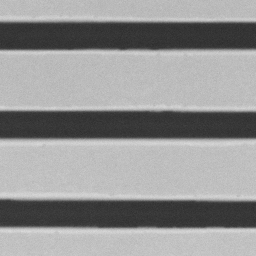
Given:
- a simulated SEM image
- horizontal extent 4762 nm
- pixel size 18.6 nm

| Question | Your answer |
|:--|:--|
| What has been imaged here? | lines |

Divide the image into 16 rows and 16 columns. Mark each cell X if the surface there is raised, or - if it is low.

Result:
XXXXXXXXXXXXXXXX
----------------
----------------
XXXXXXXXXXXXXXXX
XXXXXXXXXXXXXXXX
XXXXXXXXXXXXXXXX
XXXXXXXXXXXXXXXX
----------------
----------------
XXXXXXXXXXXXXXXX
XXXXXXXXXXXXXXXX
XXXXXXXXXXXXXXXX
--------------XX
----------------
XXXXXXXXXXXXXXXX
XXXXXXXXXXXXXXXX